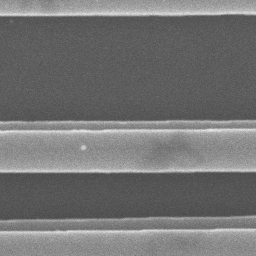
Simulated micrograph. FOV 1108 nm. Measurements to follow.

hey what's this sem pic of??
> lines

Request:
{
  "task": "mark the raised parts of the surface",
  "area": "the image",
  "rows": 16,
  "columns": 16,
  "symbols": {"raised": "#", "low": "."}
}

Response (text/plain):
################
................
................
................
................
................
................
................
################
################
################
................
................
................
################
################